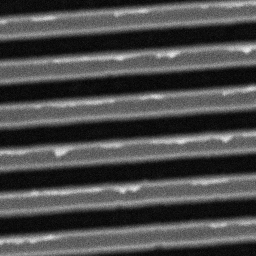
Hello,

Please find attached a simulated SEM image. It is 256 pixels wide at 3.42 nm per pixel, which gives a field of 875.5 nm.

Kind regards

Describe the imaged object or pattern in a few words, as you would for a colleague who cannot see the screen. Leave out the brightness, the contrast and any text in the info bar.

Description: parallel lines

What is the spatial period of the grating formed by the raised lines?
43.8 pixels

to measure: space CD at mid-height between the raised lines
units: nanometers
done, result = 72.9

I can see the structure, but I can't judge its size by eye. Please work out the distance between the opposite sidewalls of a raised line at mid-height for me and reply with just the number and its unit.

75.9 nm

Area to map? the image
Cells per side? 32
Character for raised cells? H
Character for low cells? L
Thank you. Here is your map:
LLLLLLLLLLLLLLLLLLLLLLLHHHHHHHHH
LLLLLLLLLLHHHHHHHHHHHHHHHHHHHHHH
HHHHHHHHHHHHHHHHHHHHHHHHHHHHHHHH
HHHHHHHHHHHHHHHHHHHLLLLLLLLLLLLL
HHHHHHLLLLLLLLLLLLLLLLLLLLLLLLLL
LLLLLLLLLLLLLLLLLLLLLLLLLLLLLLHH
LLLLLLLLLLLLLLLLLHHHHHHHHHHHHHHH
LLLLHHHHHHHHHHHHHHHHHHHHHHHHHHHH
HHHHHHHHHHHHHHHHHHHHHHHHHHHLLLLL
HHHHHHHHHHHHHLLLLLLLLLLLLLLLLLLL
LLLLLLLLLLLLLLLLLLLLLLLLLLLLLLLL
LLLLLLLLLLLLLLLLLLLLLLHHHHHHHHHH
LLLLLLLLHHHHHHHHHHHHHHHHHHHHHHHH
HHHHHHHHHHHHHHHHHHHHHHHHHHHHHHHH
HHHHHHHHHHHHHHHHHHHLLLLLLLLLLLLL
HHHHHHLLLLLLLLLLLLLLLLLLLLLLLLLL
LLLLLLLLLLLLLLLLLLLLLLLLLLLLLHHH
LLLLLLLLLLLLLLLLHHHHHHHHHHHHHHHH
LLLLHHHHHHHHHHHHHHHHHHHHHHHHHHHH
HHHHHHHHHHHHHHHHHHHHHHHHHHLLLLLL
HHHHHHHHHHHHLLLLLLLLLLLLLLLLLLLL
LLLLLLLLLLLLLLLLLLLLLLLLLLLLLLLL
LLLLLLLLLLLLLLLLLLLLLLHHHHHHHHHH
LLLLLLLLHHHHHHHHHHHHHHHHHHHHHHHH
HHHHHHHHHHHHHHHHHHHHHHHHHHHHHHHH
HHHHHHHHHHHHHHHHHHHLLLLLLLLLLLLL
HHHHHHLLLLLLLLLLLLLLLLLLLLLLLLLL
LLLLLLLLLLLLLLLLLLLLLLLLLLLLLHHH
LLLLLLLLLLLLLLLLHHHHHHHHHHHHHHHH
LLHHHHHHHHHHHHHHHHHHHHHHHHHHHHHH
HHHHHHHHHHHHHHHHHHHHHHHHHHLLLLLL
HHHHHHHHHHHHLLLLLLLLLLLLLLLLLLLL